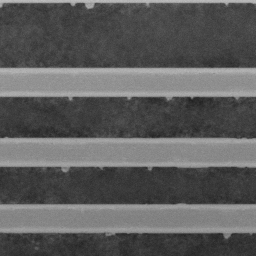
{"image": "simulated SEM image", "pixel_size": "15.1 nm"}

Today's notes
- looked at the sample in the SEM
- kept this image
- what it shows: lines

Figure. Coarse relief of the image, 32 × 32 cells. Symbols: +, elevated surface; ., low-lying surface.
................................
................................
................................
................................
................................
................................
................................
................................
................................
++++++++++++++++++++++++++++++++
++++++++++++++++++++++++++++++++
++++++++++++++++++++++++++++++++
................................
................................
................................
................................
................................
++++++++++++++++++++++++++++++++
++++++++++++++++++++++++++++++++
++++++++++++++++++++++++++++++++
++++++++++++++++++++++++++++++++
................................
................................
................................
................................
................................
++++++++++++++++++++++++++++++++
++++++++++++++++++++++++++++++++
++++++++++++++++++++++++++++++++
................................
................................
................................